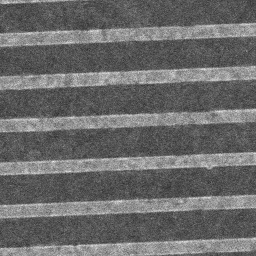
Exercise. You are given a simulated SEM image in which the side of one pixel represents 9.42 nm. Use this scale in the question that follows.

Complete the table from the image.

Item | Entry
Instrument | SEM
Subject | parallel lines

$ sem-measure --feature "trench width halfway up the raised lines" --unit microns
0.298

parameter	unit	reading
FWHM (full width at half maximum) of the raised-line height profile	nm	108